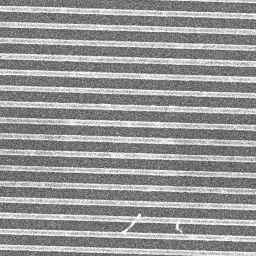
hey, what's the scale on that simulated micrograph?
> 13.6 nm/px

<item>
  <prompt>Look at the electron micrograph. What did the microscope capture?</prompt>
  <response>parallel lines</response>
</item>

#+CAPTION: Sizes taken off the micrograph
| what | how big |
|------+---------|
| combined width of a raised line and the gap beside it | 216 nm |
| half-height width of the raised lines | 67.8 nanometers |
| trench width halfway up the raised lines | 149 nm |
